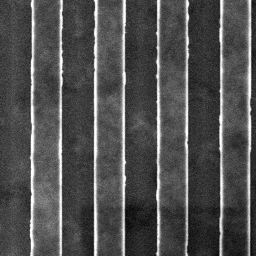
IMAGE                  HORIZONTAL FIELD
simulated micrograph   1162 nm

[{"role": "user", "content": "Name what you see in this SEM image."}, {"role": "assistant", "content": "lines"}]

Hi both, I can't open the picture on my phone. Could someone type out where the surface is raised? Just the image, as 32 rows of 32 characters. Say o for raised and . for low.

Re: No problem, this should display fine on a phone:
....oooo....oooo....oooo....ooo.
....oooo....oooo....oooo....ooo.
....oooo....oooo....oooo....ooo.
....oooo....oooo....ooo.....ooo.
....oooo....oooo....oooo....ooo.
....oooo....oooo....oooo....ooo.
....oooo....oooo....oooo....ooo.
....oooo....oooo....oooo....ooo.
....oooo....oooo....ooo.....ooo.
....oooo....oooo....ooo.....ooo.
....oooo....oooo....ooo.....ooo.
....oooo....oooo....ooo.....ooo.
....oooo....oooo....ooo.....ooo.
....oooo....oooo....ooo.....ooo.
....oooo....oooo....ooo.....ooo.
....oooo....oooo....ooo.....ooo.
....oooo....oooo....ooo.....ooo.
....oooo....oooo....ooo.....ooo.
....oooo....oooo....ooo.....ooo.
....oooo....oooo....ooo.....ooo.
....oooo....oooo....ooo.....ooo.
....oooo....oooo....ooo.....ooo.
....oooo....oooo....ooo.....ooo.
....oooo....oooo....ooo.....ooo.
....oooo....oooo....ooo.....ooo.
....oooo....oooo....ooo.....ooo.
....oooo....oooo....ooo.....ooo.
....oooo....oooo....ooo.....ooo.
....oooo....oooo....ooo.....ooo.
....oooo....oooo....ooo.....ooo.
....oooo....oooo....ooo.....ooo.
....oooo....oooo....ooo.....ooo.